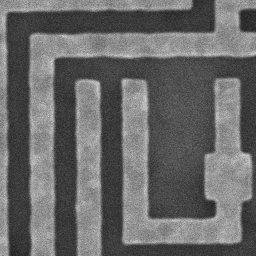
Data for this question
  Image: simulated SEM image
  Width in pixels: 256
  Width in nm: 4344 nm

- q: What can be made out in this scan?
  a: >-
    wiring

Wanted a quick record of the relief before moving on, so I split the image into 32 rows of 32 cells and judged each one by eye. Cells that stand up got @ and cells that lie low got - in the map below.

@@@@@@@@@@@@@@@@@@@@@@@@---@@@@@
@--------------------------@@@--
@--------------------------@@@--
@--------------------------@@@--
@---@@@@@@@@@@@@@@@@@@@@@@@@@@@@
@---@@@@@@@@@@@@@@@@@@@@@@@@@@@@
@---@@@@@@@@@@@@@@@@@@@@@@@@@@@@
@---@@@-------------------------
@---@@@-------------------------
@---@@@-------------------------
@---@@@---@@---@@@---------@@@--
@---@@@---@@---@@@---------@@@--
@---@@@---@@---@@@---------@@@--
@---@@@---@@---@@@---------@@@--
@---@@@---@@@--@@@---------@@@--
@---@@@---@@@--@@@---------@@@--
@---@@@---@@@--@@@---------@@@--
@---@@@---@@@--@@@---------@@@--
@---@@@---@@@--@@@---------@@@--
@---@@@---@@@--@@@--------@@@@@-
@---@@@---@@---@@@--------@@@@@-
@---@@@---@@---@@@--------@@@@@-
@---@@@---@@@--@@@--------@@@@@-
@---@@@---@@@--@@@--------@@@@@-
@---@@@---@@@--@@@--------@@@@@-
@---@@@---@@@--@@@---------@@@--
@---@@@---@@@--@@@---------@@@--
@---@@@---@@@--@@@@-@@@@-@@@@@--
@---@@@---@@@--@@@@@@@@@@@@@@@--
@---@@@---@@@--@@@@@@@@@@@@@@@--
@---@@@---@@@---@---------------
@---@@@---@@@-------------------